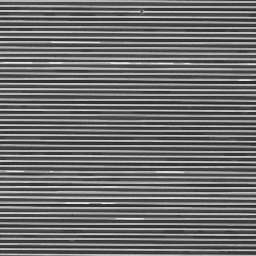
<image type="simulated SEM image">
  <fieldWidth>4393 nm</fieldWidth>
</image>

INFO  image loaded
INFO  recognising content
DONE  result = parallel lines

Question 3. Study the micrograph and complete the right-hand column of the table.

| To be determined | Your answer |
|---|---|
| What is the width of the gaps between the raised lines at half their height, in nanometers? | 62.2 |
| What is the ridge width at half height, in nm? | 30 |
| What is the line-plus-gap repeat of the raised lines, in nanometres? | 88.7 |